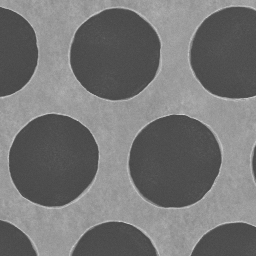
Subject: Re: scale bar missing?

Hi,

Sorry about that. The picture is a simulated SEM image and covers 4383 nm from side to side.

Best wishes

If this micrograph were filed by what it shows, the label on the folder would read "holes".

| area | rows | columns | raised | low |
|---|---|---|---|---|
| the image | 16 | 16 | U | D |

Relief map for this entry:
UUUUUUUUUUUUUUDD
DDUUUDDDDUUUUDDD
DDUUUDDDDDUUDDDD
DDUUDDDDDDUUDDDD
DDUUUDDDDDUUDDDD
DUUUUDDDDUUUUDDD
UUUUUUUUUUUUUUUU
UUDDDUUUUUDDUUUU
UDDDDDUUUDDDDUUU
UDDDDDUUDDDDDDUU
UDDDDDUUDDDDDDUU
UDDDDDUUDDDDDUUU
UUDDDUUUUDDDUUUU
UUUUUUUUUUUUUUUU
DUUUUDDDDUUUUDDD
DDUUUDDDDDUUDDDD